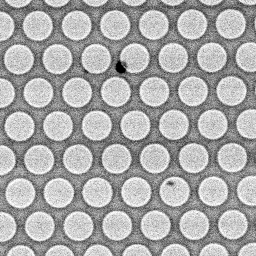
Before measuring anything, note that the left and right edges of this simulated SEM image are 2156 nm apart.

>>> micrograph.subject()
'an array of small figures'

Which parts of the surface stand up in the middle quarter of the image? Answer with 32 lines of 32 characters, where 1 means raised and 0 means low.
10000111111000011111100011111100
10000011110000001110000001111000
00000000000000000000000000000000
00000000000000000000001000000001
01111100001111100000111110000011
11111100001111110001111111000111
11111110001111110001111111000111
11111110001111110001111111000111
11111100001111110001111111000111
01111100001111100000111110000011
00110000000000000000000000000000
00000000000000000000000000000000
00000011110000001111000001111100
10000111111000011111100011111110
11000111111100111111100011111110
11000111111100111111100011111110
11000111111100011111100011111110
10000111111000011111100001111100
00000011110000001110000000111000
00000000000000000000000000000000
00111000000011000000011100000001
01111100001111110000111111000111
11111110001111110001111111000111
11111110001111111001111111000111
11111110001111110001111111000111
11111110001111110000111111000111
01111100000111100000011110000011
00000000000000000000000000000000
00000000000000000000000000011000
10000011111000011111100001111100
11000111111000011111100011111110
11000111111100011111110011111110